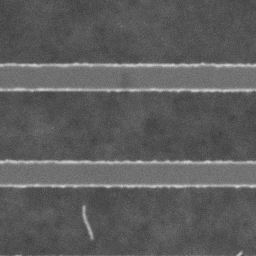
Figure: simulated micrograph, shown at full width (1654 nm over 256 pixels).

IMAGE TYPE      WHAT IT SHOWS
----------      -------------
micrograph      lines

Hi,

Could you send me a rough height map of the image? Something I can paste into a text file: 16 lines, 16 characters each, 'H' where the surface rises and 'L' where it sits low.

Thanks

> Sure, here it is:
LLLLLLLLLLLLLLLL
LLLLLLLLLLLLLLLL
LLLLLLLLLLLLLLLL
LLLLLLLLLLLLLLLL
HHHHHHHHHHHHHHHH
HHHHHHHHHHHHHHHH
LLLLLLLLLLLLLLLL
LLLLLLLLLLLLLLLL
LLLLLLLLLLLLLLLL
LLLLLLLLLLLLLLLL
HHHHHHHHHHHHHHHH
HHHHHHHHHHHHHHHH
LLLLLLLLLLLLLLLL
LLLLLLLLLLLLLLLL
LLLLLLLLLLLLLLLL
LLLLLLLLLLLLLLLL